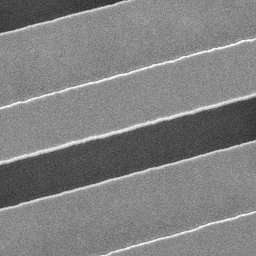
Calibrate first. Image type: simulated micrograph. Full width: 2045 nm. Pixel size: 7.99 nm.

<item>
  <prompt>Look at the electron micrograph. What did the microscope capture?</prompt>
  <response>lines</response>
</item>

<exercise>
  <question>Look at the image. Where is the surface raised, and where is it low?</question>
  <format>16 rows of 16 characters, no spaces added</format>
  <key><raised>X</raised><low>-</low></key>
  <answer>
------XXXXXXXXXX
--XXXXXXXXXXXXXX
XXXXXXXXXXXXXXXX
XXXXXXXXXXXXXXXX
XXXXXXXXXXXXXXXX
XXXXXXXXXXXXXXXX
XXXXXXXXXXXXXX--
XXXXXXXXXX------
XXXXXX----------
XXX----------XXX
----------XXXXXX
------XXXXXXXXXX
--XXXXXXXXXXXXXX
XXXXXXXXXXXXXXXX
XXXXXXXXXXXXXXXX
XXXXXXXXXXXXXXXX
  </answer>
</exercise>